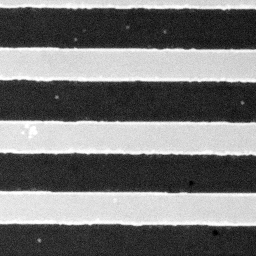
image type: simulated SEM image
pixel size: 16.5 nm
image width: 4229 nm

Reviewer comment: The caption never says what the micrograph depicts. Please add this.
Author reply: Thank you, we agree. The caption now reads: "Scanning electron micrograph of lines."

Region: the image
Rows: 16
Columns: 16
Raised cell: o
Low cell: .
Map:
.......ooooooooo
................
................
oooooooooooooooo
oooooooooooooooo
................
................
................
oooooooooooooooo
oooooooooooooooo
................
................
oooooooooooooooo
oooooooooooooooo
................
................